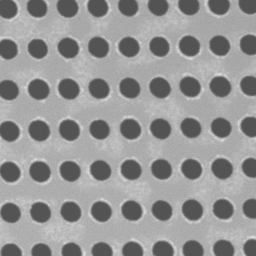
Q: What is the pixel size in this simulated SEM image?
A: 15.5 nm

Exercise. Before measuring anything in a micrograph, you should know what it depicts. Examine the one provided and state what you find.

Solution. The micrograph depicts a regular array of holes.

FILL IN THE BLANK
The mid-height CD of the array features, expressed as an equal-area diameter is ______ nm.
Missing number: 330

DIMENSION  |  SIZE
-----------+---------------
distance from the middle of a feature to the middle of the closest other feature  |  0.467 microns